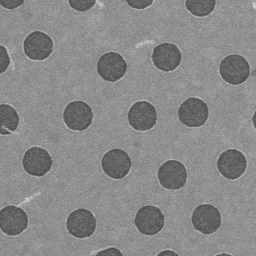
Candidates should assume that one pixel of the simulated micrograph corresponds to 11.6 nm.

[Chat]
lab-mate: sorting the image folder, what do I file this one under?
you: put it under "a regular array of holes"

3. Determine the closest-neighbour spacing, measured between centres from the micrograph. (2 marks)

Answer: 55.8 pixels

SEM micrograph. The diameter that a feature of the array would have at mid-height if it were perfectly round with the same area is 354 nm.